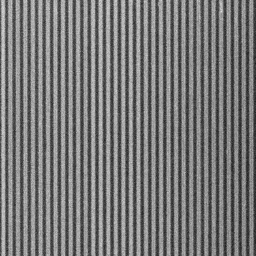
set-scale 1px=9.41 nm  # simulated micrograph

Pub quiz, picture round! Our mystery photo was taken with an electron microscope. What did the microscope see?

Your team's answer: parallel lines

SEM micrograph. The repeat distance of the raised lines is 70.8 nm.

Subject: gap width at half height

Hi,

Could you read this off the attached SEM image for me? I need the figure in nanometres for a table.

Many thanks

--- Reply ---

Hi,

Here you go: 47.1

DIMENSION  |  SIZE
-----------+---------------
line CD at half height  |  23.5 nm